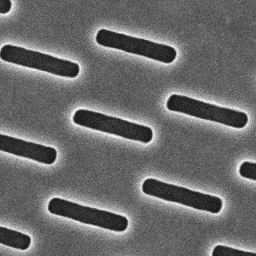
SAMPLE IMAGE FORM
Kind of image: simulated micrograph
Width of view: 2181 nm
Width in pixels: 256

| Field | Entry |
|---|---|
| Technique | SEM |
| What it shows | holes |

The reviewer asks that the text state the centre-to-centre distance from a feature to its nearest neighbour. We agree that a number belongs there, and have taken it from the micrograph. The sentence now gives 752 nm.